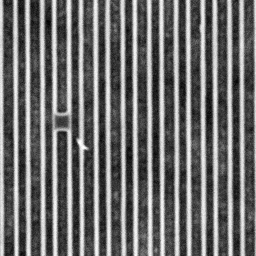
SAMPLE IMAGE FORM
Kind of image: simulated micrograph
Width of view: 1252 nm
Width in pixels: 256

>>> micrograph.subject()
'parallel lines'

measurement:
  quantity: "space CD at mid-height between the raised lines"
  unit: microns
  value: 0.0526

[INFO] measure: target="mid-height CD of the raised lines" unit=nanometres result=17.1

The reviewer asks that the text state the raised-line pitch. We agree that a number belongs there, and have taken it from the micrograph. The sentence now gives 65.1 nm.